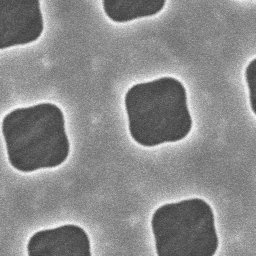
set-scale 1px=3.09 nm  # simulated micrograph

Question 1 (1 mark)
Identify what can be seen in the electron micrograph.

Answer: holes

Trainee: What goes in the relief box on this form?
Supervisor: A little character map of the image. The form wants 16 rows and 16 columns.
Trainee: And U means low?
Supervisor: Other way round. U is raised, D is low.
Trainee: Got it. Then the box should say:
DDDUUUDDDDUUUUUU
DDDUUUUUUUUUUUUU
DDUUUUUUUUUUUUUU
UUUUUUUUUUUUUUUU
UUUUUUUUUUUUUUUD
UUUUUUUUDDDDUUUD
UUDUUUUUDDDDUUUU
DDDDUUUUDDDDUUUU
DDDDUUUUDDDDUUUU
DDDDUUUUUUUUUUUU
UDDUUUUUUUUUUUUU
UUUUUUUUUUUUUUUU
UUUUUUUUUUUUDUUU
UUUUUUUUUUDDDUUU
UUDDDUUUUUDDDDUU
UUDDDDUUUUDDDDUU